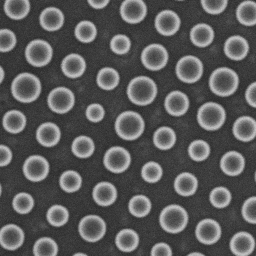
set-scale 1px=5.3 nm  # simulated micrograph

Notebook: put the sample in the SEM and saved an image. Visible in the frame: a regular array of raised bodies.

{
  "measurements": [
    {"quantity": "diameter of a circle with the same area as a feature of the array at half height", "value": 119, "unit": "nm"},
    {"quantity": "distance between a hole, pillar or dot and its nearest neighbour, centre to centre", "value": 192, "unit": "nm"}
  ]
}